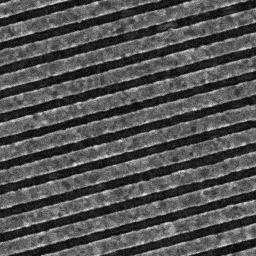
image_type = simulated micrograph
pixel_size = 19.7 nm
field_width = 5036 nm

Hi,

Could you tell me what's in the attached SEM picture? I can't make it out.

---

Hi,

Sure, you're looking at parallel lines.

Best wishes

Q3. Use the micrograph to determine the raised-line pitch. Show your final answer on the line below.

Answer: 455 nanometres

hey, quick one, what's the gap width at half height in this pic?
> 193 nm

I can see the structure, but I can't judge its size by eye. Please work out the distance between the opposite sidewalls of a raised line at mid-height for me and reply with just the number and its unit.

264 nanometers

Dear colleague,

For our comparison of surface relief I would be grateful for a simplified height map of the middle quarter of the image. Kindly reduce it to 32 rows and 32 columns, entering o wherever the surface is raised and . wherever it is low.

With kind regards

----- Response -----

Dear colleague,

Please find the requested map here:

oooooo..........ooooooooooooo...
ooo.........ooooooooooooo.......
.........ooooooooooooo.........o
....oooooooooooooo..........oooo
oooooooooooooo..........oooooooo
oooooooooo..........oooooooooooo
oooooo..........oooooooooooooo..
ooo.........ooooooooooooo.......
.........ooooooooooooo.........o
.....ooooooooooooo.........ooooo
.ooooooooooooo.........ooooooooo
ooooooooooo........ooooooooooooo
oooooo.........ooooooooooooo....
ooo.........oooooooooooooo......
.......oooooooooooooo..........o
....oooooooooooooo.........ooooo
oooooooooooooo.........ooooooooo
ooooooooo.........oooooooooooooo
oooooo..........ooooooooooooo...
ooo.........ooooooooooooo.......
........ooooooooooooo..........o
....oooooooooooooo.........ooooo
ooooooooooooo..........ooooooooo
ooooooooo..........ooooooooooooo
oooooo..........ooooooooooooo...
oo..........ooooooooooooo.......
........ooooooooooooo..........o
....ooooooooooooo..........ooooo
ooooooooooooo..........ooooooooo
oooooooooo.........ooooooooooooo
oooooo.........oooooooooooooo...
oo..........ooooooooooooo.......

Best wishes